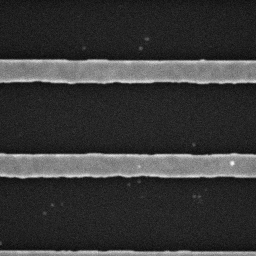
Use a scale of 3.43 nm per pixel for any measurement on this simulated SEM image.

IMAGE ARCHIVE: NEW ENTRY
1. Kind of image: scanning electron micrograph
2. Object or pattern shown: lines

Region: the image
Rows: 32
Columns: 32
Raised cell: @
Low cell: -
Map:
--------------------------------
--------------------------------
--------------------------------
--------------------------------
--------------------------------
--------------------------------
--------------------------------
--------------------------------
@@@@@@@@@@@@@@@@@@@@@@@@@@@@@@@@
@@@@@@@@@@@@@@@@@@@@@@@@@@@@@@@@
--------------------------------
--------------------------------
--------------------------------
--------------------------------
--------------------------------
--------------------------------
--------------------------------
--------------------------------
--------------------------------
@@@@@@@@@@@@@@@@@@@@@@@@@@@@@@@@
@@@@@@@@@@@@@@@@@@@@@@@@@@@@@@@@
@@@@@@@@@@@@@@@@@@@@@@@@@@@@@@@@
--------------------------------
--------------------------------
--------------------------------
--------------------------------
--------------------------------
--------------------------------
--------------------------------
--------------------------------
--------------------------------
@@@@@@@@@@@@@@@@@---@@@@--------